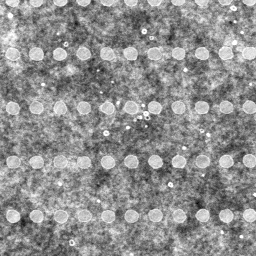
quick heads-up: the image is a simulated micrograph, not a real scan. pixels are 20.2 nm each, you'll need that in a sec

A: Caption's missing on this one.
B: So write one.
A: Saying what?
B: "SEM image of a regular array of raised bodies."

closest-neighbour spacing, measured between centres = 23.5 px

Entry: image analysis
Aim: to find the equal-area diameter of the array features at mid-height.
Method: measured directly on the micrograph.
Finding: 13.1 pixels